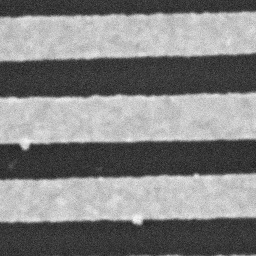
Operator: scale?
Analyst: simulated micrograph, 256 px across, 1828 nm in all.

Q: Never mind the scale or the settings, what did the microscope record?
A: lines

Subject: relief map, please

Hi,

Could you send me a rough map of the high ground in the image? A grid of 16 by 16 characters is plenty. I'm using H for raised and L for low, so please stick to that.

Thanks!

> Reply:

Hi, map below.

LLLLLLLLLLLLLLLL
HHHHHHHHHHHHHHHH
HHHHHHHHHHHHHHHH
HHHHHHHHHLLLLLLL
LLLLLLLLLLLLLLLL
LLLLLLLLLLLLLLLL
HHHHHHHHHHHHHHHH
HHHHHHHHHHHHHHHH
HHHHHHHHHHHHHHHH
LLLLLLLLLLLLLLLL
LLLLLLLLLLLLLLLL
HHHHHHHHHHHHHHHH
HHHHHHHHHHHHHHHH
HHHHHHHHHHHHHHHH
LLLLLLLLLLLLLLLL
LLLLLLLLLLLLLLLL